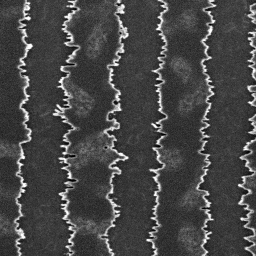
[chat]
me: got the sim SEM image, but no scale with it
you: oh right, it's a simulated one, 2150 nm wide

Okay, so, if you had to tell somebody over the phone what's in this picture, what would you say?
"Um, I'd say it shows one or a few lines or trenches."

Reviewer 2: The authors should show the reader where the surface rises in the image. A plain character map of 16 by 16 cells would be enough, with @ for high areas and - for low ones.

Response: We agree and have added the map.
@@---@@---@@@---
@---@@@@--@@@---
@@--@@@@--@@@---
@@--@@@---@@@---
@---@@@---@@@---
@@--@@@---@@@---
@@--@@@---@@@---
@@--@@@---@@@---
@@--@@@---@@@---
@---@@@---@@@--@
@---@@@---@@@---
@---@@@---@@@--@
@---@@@---@@@--@
@---@@@---@@@--@
@---@@@---@@@---
@---@@@---@@@---